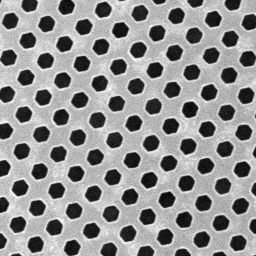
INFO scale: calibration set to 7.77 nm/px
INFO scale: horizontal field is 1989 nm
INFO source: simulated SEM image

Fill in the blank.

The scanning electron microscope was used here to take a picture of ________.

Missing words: a regular array of holes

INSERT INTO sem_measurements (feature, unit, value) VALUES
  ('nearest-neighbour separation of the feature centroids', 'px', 25.4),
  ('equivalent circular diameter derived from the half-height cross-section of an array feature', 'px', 16.8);